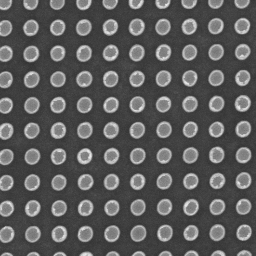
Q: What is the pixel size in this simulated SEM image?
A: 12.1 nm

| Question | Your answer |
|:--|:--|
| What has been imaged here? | a regular array of raised bodies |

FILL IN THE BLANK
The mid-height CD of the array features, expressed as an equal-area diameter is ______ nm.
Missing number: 179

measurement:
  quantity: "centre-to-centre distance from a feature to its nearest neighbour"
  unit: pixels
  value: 25.7